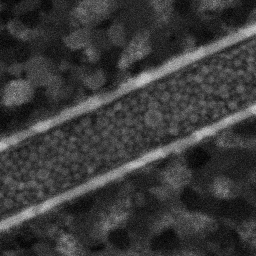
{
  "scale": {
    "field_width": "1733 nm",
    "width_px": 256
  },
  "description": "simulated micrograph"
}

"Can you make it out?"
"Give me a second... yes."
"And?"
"one or a few lines or trenches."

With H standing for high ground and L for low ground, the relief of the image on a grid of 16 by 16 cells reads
HHHHHHHHHHHHHHHH
HHHHHHHHHHHHHHHH
HHHHHHHHHHHHHHHL
HHHHHHHHHHHHLLLL
HHHHHHHHHHLLLLLL
HHHHHHHHLLLLLLLL
HHHHHHLLLLLLLLLL
HHHHLLLLLLLLLLHH
HLLLLLLLLLLLHHHH
LLLLLLLLLLHHHHHH
LLLLLLLLHHHHHHHH
LLLLLLHHHHHHHHHH
LLLLHHHHHHHHHHHH
LHHHHHHHHHHHHHHH
HHHHHHHHHHHHHHHH
HHHHHHHHHHHHHHHH